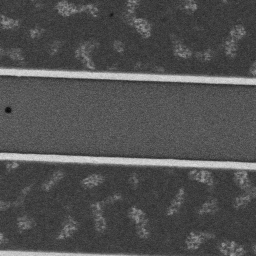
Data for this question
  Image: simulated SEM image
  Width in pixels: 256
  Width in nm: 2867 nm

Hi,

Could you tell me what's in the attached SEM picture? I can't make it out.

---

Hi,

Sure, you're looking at one or a few lines or trenches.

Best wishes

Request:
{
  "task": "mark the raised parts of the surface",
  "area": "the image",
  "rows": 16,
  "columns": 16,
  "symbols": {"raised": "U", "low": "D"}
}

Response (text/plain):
UUUUUUUUUUUUUUUU
UUUUUUUUUUUUUUUU
UUUUUUUUUUUUUUUU
UUUUUUUUUUUUUUUU
DUUUUUUUUUUUUUUU
DDDDDDDDDDDDDDDD
DDDDDDDDDDDDDDDD
DDDDDDDDDDDDDDDD
DDDDDDDDDDDDDDDD
DDDDDDDDDDDDDDDD
UUUUUUUUUUUUUUUU
UUUUUUUUUUUUUUUU
UUUUUUUUUUUUUUUU
UUUUUUUUUUUUUUUU
UUUUUUUUUUUUUUUU
UUUUUUUUUUUUUUUU